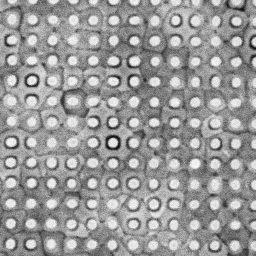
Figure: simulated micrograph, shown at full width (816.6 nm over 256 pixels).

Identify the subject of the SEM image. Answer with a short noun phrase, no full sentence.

a regular array of raised bodies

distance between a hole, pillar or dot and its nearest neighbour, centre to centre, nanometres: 64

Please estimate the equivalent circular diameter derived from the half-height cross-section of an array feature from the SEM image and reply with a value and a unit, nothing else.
9.44 px